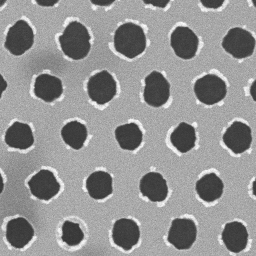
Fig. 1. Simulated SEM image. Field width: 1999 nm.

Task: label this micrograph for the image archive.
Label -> a regular array of holes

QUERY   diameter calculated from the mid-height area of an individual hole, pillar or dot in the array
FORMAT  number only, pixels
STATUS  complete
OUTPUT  29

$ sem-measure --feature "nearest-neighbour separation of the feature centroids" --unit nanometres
420